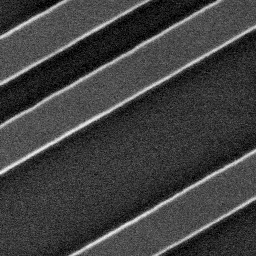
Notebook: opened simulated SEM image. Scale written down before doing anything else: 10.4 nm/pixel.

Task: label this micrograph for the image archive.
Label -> lines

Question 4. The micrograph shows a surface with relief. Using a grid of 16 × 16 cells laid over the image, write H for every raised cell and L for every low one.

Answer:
LLLHHHHHLLLLLHHH
LHHHHHHLLLLHHHHH
HHHHHLLLLHHHHHHL
HHHLLLLLHHHHHLLL
HLLLLLHHHHHLLLLL
LLLLHHHHHLLLLLLL
LLHHHHHHLLLLLLLL
LHHHHHLLLLLLLLLL
HHHHLLLLLLLLLLLL
HHLLLLLLLLLLLLLL
HLLLLLLLLLLLLLHH
LLLLLLLLLLLLHHHH
LLLLLLLLLLHHHHHH
LLLLLLLLLHHHHHLL
LLLLLLLHHHHHLLLL
LLLLLHHHHHHLLLLL